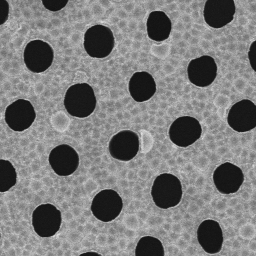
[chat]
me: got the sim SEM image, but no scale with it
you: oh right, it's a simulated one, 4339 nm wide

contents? a regular array of holes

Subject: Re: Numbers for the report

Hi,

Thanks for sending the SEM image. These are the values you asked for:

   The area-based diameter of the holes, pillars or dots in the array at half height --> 524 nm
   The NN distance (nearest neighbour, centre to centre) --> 1050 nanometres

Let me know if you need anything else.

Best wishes